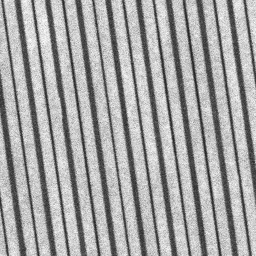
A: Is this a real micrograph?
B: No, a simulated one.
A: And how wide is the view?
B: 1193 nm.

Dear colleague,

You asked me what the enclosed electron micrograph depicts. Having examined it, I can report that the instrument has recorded parallel lines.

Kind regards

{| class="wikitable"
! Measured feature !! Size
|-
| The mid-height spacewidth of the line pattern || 4.83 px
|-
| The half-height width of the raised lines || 50.2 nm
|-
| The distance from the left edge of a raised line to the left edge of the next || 69.9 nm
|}